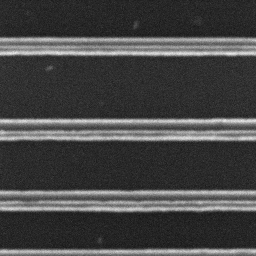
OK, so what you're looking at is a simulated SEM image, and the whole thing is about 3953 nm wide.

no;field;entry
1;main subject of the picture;lines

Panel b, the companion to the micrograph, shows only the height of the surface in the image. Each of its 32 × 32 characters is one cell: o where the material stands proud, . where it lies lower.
................................
................................
................................
................................
................................
oooooooooooooooooooooooooooooooo
oooooooooooooooooooooooooooooooo
................................
................................
................................
................................
................................
................................
................................
................................
oooooooooooooooooooooooooooooooo
oooooooooooooooooooooooooooooooo
................................
................................
................................
................................
................................
................................
................................
oooooooooooooooooooooooooooooooo
oooooooooooooooooooooooooooooooo
................................
................................
................................
................................
................................
oooooooooooooooooooooooooooooooo